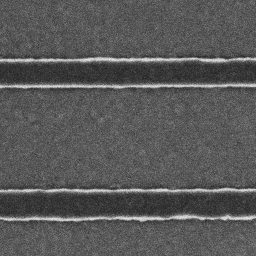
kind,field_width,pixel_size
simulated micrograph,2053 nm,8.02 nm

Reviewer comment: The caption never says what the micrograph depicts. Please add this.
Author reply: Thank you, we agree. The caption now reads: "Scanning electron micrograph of one or a few lines or trenches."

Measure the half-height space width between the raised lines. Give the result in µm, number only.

0.832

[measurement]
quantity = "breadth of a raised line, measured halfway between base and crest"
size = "228 nm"